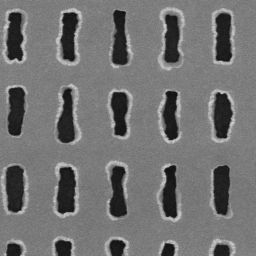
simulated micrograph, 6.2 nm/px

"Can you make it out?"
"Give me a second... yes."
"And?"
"a regular array of holes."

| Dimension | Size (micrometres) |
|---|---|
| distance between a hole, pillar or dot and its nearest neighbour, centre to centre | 0.319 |